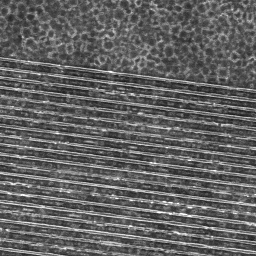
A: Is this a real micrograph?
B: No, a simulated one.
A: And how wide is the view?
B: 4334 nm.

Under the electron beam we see parallel lines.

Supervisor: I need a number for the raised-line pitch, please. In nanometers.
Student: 159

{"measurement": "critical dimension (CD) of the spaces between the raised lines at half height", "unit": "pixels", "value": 6.94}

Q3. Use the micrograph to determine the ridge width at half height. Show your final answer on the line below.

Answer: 33.6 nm